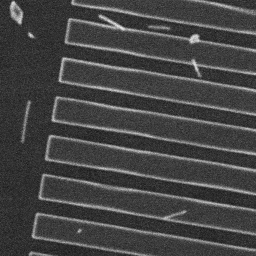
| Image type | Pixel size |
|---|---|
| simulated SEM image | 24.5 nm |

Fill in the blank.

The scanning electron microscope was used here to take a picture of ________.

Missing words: groups of lines, slits or small figures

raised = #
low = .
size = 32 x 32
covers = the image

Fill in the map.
.........##################.....
.##.............################
.........#...........###########
........########...........#####
........##############..#.......
.........##################.....
................################
........#............###########
........#######...........######
........##############..........
.........##################.....
...............#################
.......###...........###########
.......########............#####
.......###############..........
.........###################....
...............#################
......####...........###########
......#########...........######
......###############...........
.........###################....
...............#################
.....#####...........###########
.....#########..............####
.....################...........
.........##################.....
...............#################
....######...........###########
....############...........#####
....#################...........
.........###################....
...............#################